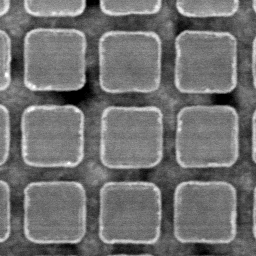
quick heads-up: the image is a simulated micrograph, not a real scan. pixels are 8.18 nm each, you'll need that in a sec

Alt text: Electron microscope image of a regular array of raised bodies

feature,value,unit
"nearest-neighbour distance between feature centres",0.615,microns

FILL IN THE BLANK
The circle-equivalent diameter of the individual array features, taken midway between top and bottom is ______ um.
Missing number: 0.547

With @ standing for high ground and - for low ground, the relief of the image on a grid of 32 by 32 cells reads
@--@@@@@@@---@@@@@@@--@@@@@@@@--
----@@@@@@---@@@@@@---@@@@@@@---
--------------------------------
--------------------------------
@--@@@@@@@---@@@@@@@--@@@@@@@---
@--@@@@@@@@-@@@@@@@@--@@@@@@@---
@--@@@@@@@--@@@@@@@@--@@@@@@@---
@--@@@@@@@---@@@@@@@--@@@@@@@---
@--@@@@@@@---@@@@@@@--@@@@@@@---
@--@@@@@@@@--@@@@@@@--@@@@@@@---
@--@@@@@@@---@@@@@@@--@@@@@@@---
-----------------@@----@@@-@----
--------------------------------
@---@@@@@@----@@@@@----@@@@@@---
@--@@@@@@@---@@@@@@@--@@@@@@@@--
@--@@@@@@@---@@@@@@@--@@@@@@@@--
@--@@@@@@@---@@@@@@@--@@@@@@@@--
@--@@@@@@@---@@@@@@@--@@@@@@@@--
@--@@@@@@@---@@@@@@@--@@@@@@@@--
@--@@@@@@@---@@@@@@@--@@@@@@@@--
----@@@@@@---@@@@@@@---@@@@@@---
--------------------------------
--------------------------------
@--@@@@@@@---@@@@@@@--@@@@@@@---
@--@@@@@@@---@@@@@@@--@@@@@@@---
@--@@@@@@@---@@@@@@@--@@@@@@@---
@--@@@@@@@@--@@@@@@@--@@@@@@@---
@--@@@@@@@@-@@@@@@@@--@@@@@@@---
@--@@@@@@@@--@@@@@@@--@@@@@@@---
@--@@@@@@@---@@@@@@@--@@@@@@@---
--------------------------------
--------------------------------